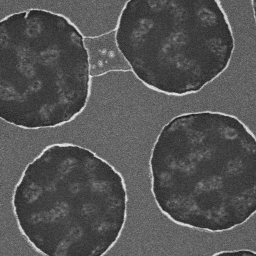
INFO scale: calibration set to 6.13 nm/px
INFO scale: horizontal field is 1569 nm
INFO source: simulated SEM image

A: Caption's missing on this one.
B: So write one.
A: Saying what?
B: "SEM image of holes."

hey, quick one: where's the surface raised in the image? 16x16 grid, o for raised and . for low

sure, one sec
oooooooo......oo
....ooo.......oo
...............o
..............oo
.......o......oo
......oooo..oooo
.....ooooooooooo
....ooooooo....o
oooooooooo......
ooo...oooo......
oo.....oo.......
o.......oo......
o.......oo......
o.......ooo.....
o......ooooooooo
oo.....ooooooooo